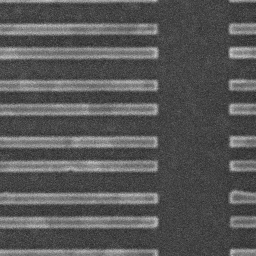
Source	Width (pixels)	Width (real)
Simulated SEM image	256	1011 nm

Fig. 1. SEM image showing parallel lines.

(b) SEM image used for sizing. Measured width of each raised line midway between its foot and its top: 31.1 nm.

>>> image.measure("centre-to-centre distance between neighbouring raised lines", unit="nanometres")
109